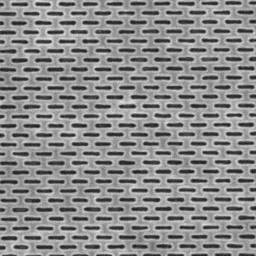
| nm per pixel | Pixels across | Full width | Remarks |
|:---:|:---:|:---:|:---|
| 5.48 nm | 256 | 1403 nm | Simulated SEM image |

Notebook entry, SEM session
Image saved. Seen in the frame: a regular array of holes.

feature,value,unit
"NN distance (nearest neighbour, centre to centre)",14.6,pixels